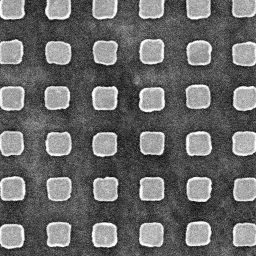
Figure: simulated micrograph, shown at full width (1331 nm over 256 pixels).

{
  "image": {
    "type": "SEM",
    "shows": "a regular array of raised bodies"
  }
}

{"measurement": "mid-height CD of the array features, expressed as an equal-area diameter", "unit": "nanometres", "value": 132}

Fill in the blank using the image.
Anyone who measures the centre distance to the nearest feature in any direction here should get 0.234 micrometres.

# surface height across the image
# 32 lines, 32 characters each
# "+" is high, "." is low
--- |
+++...+++...+++..+++...+++...+++
+++...+++...++...+++...+++...+++
................................
................................
................................
+++...++....+++...++....++....++
+++...+++...+++...++...+++...+++
+++...+++...++....++....++...+++
................................
................................
................................
+++...+++...+++...++...+++...+++
+++...+++...++....++...+++...+++
+++...++....++....++....++....++
................................
................................
.+................+...........+.
+++...+++...+++...+++..+++...+++
+++...+++...+++...++...+++...+++
................................
................................
................................
+++...+++...++....++....++....++
+++...+++...+++...++...+++...+++
+++...+++...+++...++...+++...+++
................................
................................
................................
+++...+++...++....++...+++...+++
+++...+++...+++...++...+++...+++
+++...++....++....++....++...+++
................................